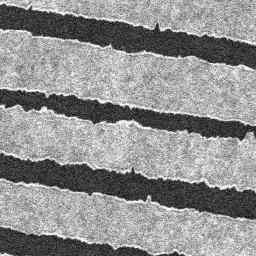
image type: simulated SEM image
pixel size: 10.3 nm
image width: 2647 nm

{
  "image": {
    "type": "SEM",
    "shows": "one or a few lines or trenches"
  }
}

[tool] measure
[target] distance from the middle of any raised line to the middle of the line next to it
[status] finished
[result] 735 nanometres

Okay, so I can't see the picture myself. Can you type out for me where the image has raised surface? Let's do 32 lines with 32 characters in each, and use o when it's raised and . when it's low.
.ooooooooooooooooooooooooooooooo
.......ooooooooooooooooooooooooo
..............oooooooooooooooooo
..................o.oooooooooooo
oooo.......................ooooo
ooooooooooo.....................
ooooooooooooooo.................
ooooooooooooooooooooooooo.......
ooooooooooooooooooooooooooooooo.
oooooooooooooooooooooooooooooooo
oooooooooooooooooooooooooooooooo
.....ooooooooooooooooooooooooooo
............oooooooooooooooooooo
ooo...............oooooooooooooo
oooooooo.................ooooooo
ooooooooooooooooo..............o
ooooooooooooooooooooo.o.........
oooooooooooooooooooooooooooooooo
oooooooooooooooooooooooooooooooo
..oooooooooooooooooooooooooooooo
...........ooooooooooooooooooooo
.................ooooooooooooooo
.......................ooooooooo
ooooooo.......................oo
ooooooooooooo...................
oooooooooooooooooooo............
ooooooooooooooooooooooooo.......
oooooooooooooooooooooooooooooooo
.ooooooooooooooooooooooooooooooo
.......ooooooooooooooooooooooooo
..............oooooooooooooooooo
..................ooo.oooooooooo